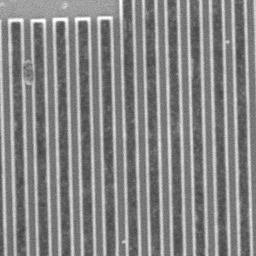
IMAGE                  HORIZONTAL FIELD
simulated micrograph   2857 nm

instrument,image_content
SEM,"parallel lines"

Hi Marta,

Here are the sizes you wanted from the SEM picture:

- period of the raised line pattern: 250 nanometres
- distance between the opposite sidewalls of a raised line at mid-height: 144 nanometres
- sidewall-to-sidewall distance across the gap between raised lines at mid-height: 105 nanometres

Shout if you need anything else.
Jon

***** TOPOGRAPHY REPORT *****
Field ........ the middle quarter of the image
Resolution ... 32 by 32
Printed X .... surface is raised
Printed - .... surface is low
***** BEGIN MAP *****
X--XXX---XXX---XXX--XXX---XXX--X
X--XXX---XXX---XXX--XXX---XXX---
X--XXX---XXX---XXX--XXX---XXX---
X---XXX--XXX---XXX--XXX---XXX---
X---XXX--XXX---XXX--XXX---XXX---
X---XXX--XXX---XXX--XXX---XXX---
X---XXX--XXX---XXX---XX---XXX---
X---XXX--XXX---XXX---XX---XXX---
X---XXX--XXX---XXX---XX---XXX---
X---XXX--XXX---XXX---XX---XXX---
X---XXX--XXX---XXX---XX---XXX---
X---XXX---XX---XXX---XX---XXX---
X---XXX---XX---XXX---XX---XXX---
X---XXX---XX---XXX---XX---XXX---
X---XXX---XX---XXX---XX---XXX---
X---XXX---XX---XXX---XXX--XXX---
X---XXX---XX---XXX---XXX--XXX---
X---XXX---XX---XXX---XXX--XXX---
X---XXX---XX---XXX---XXX--XXX---
X---XXX---XX---XXX---XXX--XXX---
X---XXX---XXX--XXX---XXX--XXX---
X---XXX---XXX--XXX---XXX--XXX---
X---XXX---XXX--XXX---XXX--XXX---
X---XXX---XXX--XXX---XXX---XX---
X---XXX---XXX--XXX---XXX---XXX--
X---XXX---XXX--XXX---XXX---XXX--
XX--XXX---XXX--XXX---XXX---XXX--
XX--XXX---XXX--XXX---XXX---XXX--
XX--XXX---XXX---XX---XXX---XXX--
XX--XXX---XXX---XX---XXX---XXX--
XX--XXX---XXX---XX---XXX---XXX--
XX--XXX---XXX---XX---XXX---XXX--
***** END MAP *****